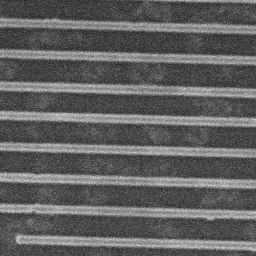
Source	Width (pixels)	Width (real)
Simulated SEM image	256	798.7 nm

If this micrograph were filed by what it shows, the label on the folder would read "parallel lines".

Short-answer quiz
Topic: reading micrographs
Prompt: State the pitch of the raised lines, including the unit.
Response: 96.4 nanometers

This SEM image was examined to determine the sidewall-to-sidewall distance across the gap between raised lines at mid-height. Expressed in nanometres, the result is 76.4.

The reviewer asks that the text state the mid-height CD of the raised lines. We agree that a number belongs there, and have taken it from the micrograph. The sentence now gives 6.63 pixels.